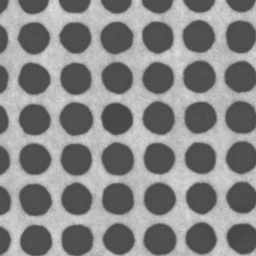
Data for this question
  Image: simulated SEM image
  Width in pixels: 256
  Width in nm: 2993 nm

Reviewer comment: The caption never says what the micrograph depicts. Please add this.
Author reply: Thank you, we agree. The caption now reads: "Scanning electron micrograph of a regular array of holes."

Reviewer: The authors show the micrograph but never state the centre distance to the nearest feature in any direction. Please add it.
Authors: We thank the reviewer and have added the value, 470 nm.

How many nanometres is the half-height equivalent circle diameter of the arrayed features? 372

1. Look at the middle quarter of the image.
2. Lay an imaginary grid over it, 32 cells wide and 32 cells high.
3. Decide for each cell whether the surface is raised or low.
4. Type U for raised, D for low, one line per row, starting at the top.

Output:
DDDDDUUUUUUDDDDDUUUUUDDDDDUUUUUD
DDDDDDUUUUDDDDDDDUUUDDDDDDDUUUDD
DDDDDDDUUDDDDDDDDUUUDDDDDDDUUUDD
DDDDDDDUUDDDDDDDDUUUDDDDDDDDUUDD
DDDDDDDUUUDDDDDDDUUUDDDDDDDUUUDD
DDDDDDDUUUDDDDDDDUUUDDDDDDDUUUDD
DDDDDDUUUUUDDDDDUUUUUDDDDDUUUUUD
UUDDUUUUUUUUUDUUUUUUUUUUUUUUUUUU
UUUUUUUUUUUUUUUUUUUUUUUUUUUUUUUU
UUUUUUUUUUUUUUUUUUUUUUUDUUUUUUUU
DDDDDDUUUUUDDDDUUUUUUDDDDDUUUUUD
DDDDDDUUUUDDDDDDUUUUDDDDDDDUUUUD
DDDDDDDUUDDDDDDDDUUUDDDDDDDUUUDD
DDDDDDDUUDDDDDDDDUUUDDDDDDDDUUDD
DDDDDDDUUUDDDDDDDUUUDDDDDDDUUUDD
DDDDDDDUUUDDDDDDDUUUDDDDDDDUUUUD
DDDDDDUUUUDDDDDDUUUUUDDDDDDUUUUD
UDDDDUUUUUUUDDUUUUUUUUUDDDUUUUUU
UUUUUUUUUUUUUUUUUUUUUUUUUUUUUUUU
UUUUUUUUUUUUUUUUUUUUUUUUUUUUUUUU
DDDDDUUUUUUDDDDDUUUUUDDDDDUUUUUU
DDDDDDUUUUDDDDDDDUUUDDDDDDDUUUUD
DDDDDDDUUDDDDDDDDUUUDDDDDDDDUUDD
DDDDDDDUUDDDDDDDDUUUDDDDDDDDUUDD
DDDDDDDUUUDDDDDDDUUUDDDDDDDDUUDD
DDDDDDDUUUDDDDDDDUUUDDDDDDDUUUUD
DDDDDDUUUUUDDDDDDUUUUDDDDDDUUUUU
UDDDDUUUUUUUDDDDUUUUUUUDDUUUUUUU
UUUUUUUUUUUUUUUUUUUUUUUUUUUUUUUU
UUUUUUUUUUUUUUUUUUUUUUUUUUUUUUUU
UDDDDUUUUUUDDDDDUUUUUDDDDDUUUUUU
DDDDDDUUUUDDDDDDDUUUUDDDDDDUUUUD